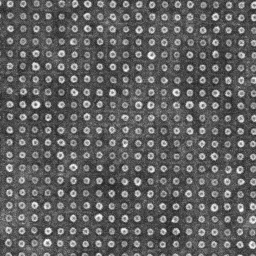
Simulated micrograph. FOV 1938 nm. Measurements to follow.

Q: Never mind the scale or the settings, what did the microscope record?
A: a regular array of raised bodies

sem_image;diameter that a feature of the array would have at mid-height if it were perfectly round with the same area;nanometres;45.2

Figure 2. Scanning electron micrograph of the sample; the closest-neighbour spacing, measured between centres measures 93.1 nanometres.